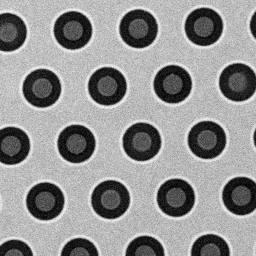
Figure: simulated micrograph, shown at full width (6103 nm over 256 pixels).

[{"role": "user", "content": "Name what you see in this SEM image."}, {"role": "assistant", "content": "an array of small figures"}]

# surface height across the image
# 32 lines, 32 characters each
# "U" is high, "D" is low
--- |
UUUUUUUUUUUUUUUUUUUUUUUUUUUUUUUU
UDUUUUUUDDUUUUUUDDDUUUUUDDDUUUUU
DDDUUUUDDDDUUUUDDDDDUUUDDDDDUUUD
DDDUUUUDDDDDUUUDDDDDUUUDDDDDUUUD
DDDUUUUDDDDDUUUDDDDDUUUDDDDDUUUD
DDDUUUUDDDDUUUUUDDDUUUUUDDDUUUUU
DDUUUUUUUUUUUUUUUUUUUUUUUUUUUUUU
UUUUUUUUUUUUUUUUUUUUUUUUUUUUUUUU
UUUUUDUUUUUUDDDUUUUUDDDUUUUUDDDD
UUUDDDDUUUUDDDDDUUUDDDDDUUUDDDDD
UUUDDDDDUUUDDDDDUUUDDDDDUUUDDDDD
UUUDDDDDUUUDDDDDUUUDDDDDUUUUDDDD
UUUDDDDUUUUUDDDUUUUUDDDUUUUUDDDU
UUUUUDUUUUUUUUUUUUUUUUUUUUUUUUUU
UUUUUUUUUUUUUUUUUUUUUUUUUUUUUUUU
UUUUUUUUUDUUUUUUDDDUUUUUDDDUUUUU
DDDUUUUDDDDDUUUDDDDDUUUUDDDDUUUU
DDDDUUUDDDDDUUUDDDDDUUUDDDDDUUUD
DDDDUUUDDDDDUUUDDDDDUUUDDDDDUUUU
DDDDUUUUDDDDUUUUDDDDUUUUDDDUUUUU
DDUUUUUUUDUUUUUUUUUUUUUUUUUUUUUU
UUUUUUUUUUUUUUUUUUUUUUUUUUUUUUUU
UUUUUUUUUUUUUDDUUUUUUDDUUUUUUDDD
UUUUDDDDUUUUDDDDUUUUDDDDUUUUDDDD
UUUDDDDDUUUDDDDDUUUUDDDDDUUUDDDD
UUUDDDDDUUUDDDDDUUUUDDDDUUUUDDDD
UUUUDDDDUUUUDDDDUUUUDDDDUUUUUDDD
UUUUUDDUUUUUUDUUUUUUUUUUUUUUUUUU
UUUUUUUUUUUUUUUUUUUUUUUUUUUUUUUU
UUUUUUUUUUUUUUUUUDDUUUUUUDDDUUUU
DDDDUUUUDDDDUUUUDDDDUUUUDDDDDUUU
DDDDUUUUDDDDUUUUDDDDDUUUDDDDDUUU